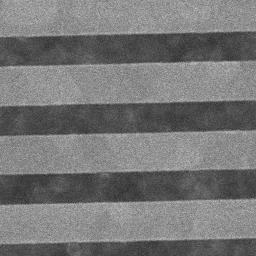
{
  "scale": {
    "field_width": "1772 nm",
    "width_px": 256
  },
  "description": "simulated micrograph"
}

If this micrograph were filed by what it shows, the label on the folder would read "one or a few lines or trenches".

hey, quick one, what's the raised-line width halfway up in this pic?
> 0.263 um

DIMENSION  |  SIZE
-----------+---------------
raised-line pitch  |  477 nm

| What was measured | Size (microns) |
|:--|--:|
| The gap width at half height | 0.211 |